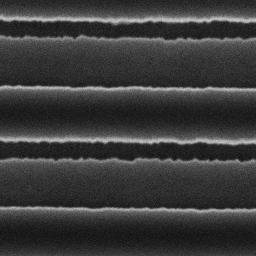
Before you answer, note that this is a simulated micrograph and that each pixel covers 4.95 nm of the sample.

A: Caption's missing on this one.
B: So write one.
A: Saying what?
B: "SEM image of lines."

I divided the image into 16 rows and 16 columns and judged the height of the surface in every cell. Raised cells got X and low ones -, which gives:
XXXXXXXXXXXXXXXX
----------------
----------------
----------------
----------------
XXXXXX-XX-------
XXXXXXXXXXXXXXXX
XXXXXXXXXXXXXXXX
XXXXXXXXXXXXXXXX
----------------
----------------
----------------
----------------
XXXXXXXXXXXXXXXX
XXXXXXXXXXXXXXXX
XXXXXXXXXXXXXXXX